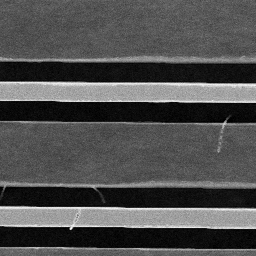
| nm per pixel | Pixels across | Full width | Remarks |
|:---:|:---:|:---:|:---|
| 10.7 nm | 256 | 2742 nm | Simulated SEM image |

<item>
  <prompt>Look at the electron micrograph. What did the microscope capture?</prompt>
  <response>lines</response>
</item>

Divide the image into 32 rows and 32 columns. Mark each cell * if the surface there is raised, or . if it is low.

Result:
********************************
********************************
********************************
********************************
********************************
********************************
********************************
********************************
................................
................................
************************........
********************************
********************************
................................
................................
********************************
********************************
********************************
********************************
********************************
********************************
********************************
********************************
...........*....................
................................
................................
********************************
********************************
..........................******
................................
................................
********************************